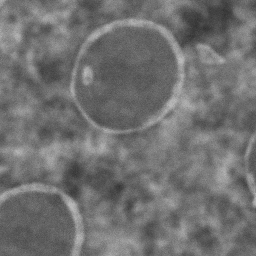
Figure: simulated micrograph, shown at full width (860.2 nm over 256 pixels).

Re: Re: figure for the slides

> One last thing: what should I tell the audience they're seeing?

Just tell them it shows raised bodies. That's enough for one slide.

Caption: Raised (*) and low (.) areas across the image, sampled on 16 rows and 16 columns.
................
.......***......
.....******.....
.....******.....
.....******.....
.....******.....
.....******.....
......****......
................
...............*
...............*
................
****............
*****...........
*****...........
*****...........